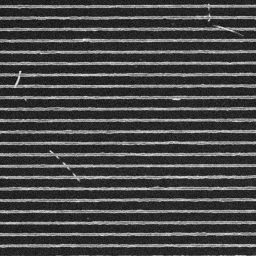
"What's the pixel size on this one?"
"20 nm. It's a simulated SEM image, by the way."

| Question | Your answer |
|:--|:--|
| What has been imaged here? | parallel lines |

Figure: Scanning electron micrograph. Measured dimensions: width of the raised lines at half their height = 47.5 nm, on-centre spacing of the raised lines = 228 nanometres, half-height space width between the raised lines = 0.178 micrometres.